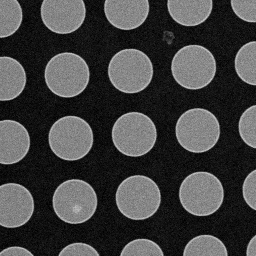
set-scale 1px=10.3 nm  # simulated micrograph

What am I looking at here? an array of small figures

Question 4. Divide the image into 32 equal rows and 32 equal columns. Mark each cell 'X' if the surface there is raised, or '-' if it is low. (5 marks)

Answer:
XX---XXXXX---XXXXXX--XXXXXX--XXX
XXX--XXXXXX--XXXXXX--XXXXX---XXX
XXX--XXXXX----XXXX----XXXX-----X
XX----XXXX-----XX---------------
X-------------------------------
-------------------------------X
---------------XXX----XXXX----XX
XX----XXXX----XXXXX---XXXXX--XXX
XXX---XXXXX---XXXXX--XXXXXX--XXX
XXX---XXXXX---XXXXX---XXXXX---XX
XXX---XXXXX---XXXXX---XXXX-----X
XXX----XXX-----XX---------------
X-------------------------------
-------------------------------X
---------------XXX-----XXXX---XX
XX-----XXXX---XXXXX---XXXXX---XX
XXX---XXXXX---XXXXXX--XXXXX---XX
XXXX--XXXXXX--XXXXX---XXXXX---XX
XXXX--XXXXX----XXXX----XXX------
XXX----XXX------X---------------
--------------------------------
--------------------------------
---------X------XXX----XXXX----X
XXX----XXXX----XXXXX---XXXXX--XX
XXXX---XXXXX---XXXXX--XXXXXX--XX
XXXX---XXXXX---XXXXX---XXXXX---X
XXXX---XXXXX---XXXX-----XXX-----
XXXX----XXX---------------------
--------------------------------
-------------------------X------
---------XX-----XXX----XXXXX---X
XXXX----XXXX---XXXXX---XXXXX---X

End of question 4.